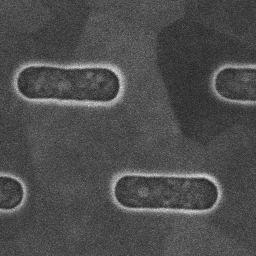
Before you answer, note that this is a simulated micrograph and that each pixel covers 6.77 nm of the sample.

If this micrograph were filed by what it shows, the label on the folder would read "holes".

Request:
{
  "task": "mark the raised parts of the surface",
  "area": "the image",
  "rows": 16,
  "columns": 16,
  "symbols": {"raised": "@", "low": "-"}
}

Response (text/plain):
@@@@@@@@@@@@@@@@
@@@@@@@@@@@@@@@@
@@@@@@@@@@@@@@@@
@@@@@@@@@@@@@@@@
@------@@@@@@@--
@------@@@@@@@--
@@@@@@@@@@@@@@@@
@@@@@@@@@@@@@@@@
@@@@@@@@@@@@@@@@
@@@@@@@@@@@@@@@@
@@@@@@@@@@@@@@@@
-@@@@@@------@@@
-@@@@@@-------@@
@@@@@@@@@@@@@@@@
@@@@@@@@@@@@@@@@
@@@@@@@@@@@@@@@@